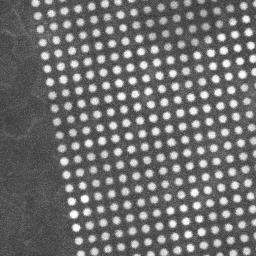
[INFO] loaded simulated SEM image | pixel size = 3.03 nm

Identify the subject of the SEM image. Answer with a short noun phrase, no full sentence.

a regular array of raised bodies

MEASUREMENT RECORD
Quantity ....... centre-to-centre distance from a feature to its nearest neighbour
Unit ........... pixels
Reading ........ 13.3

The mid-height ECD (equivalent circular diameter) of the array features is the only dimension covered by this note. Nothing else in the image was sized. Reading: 21.9 nanometers